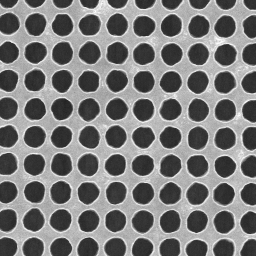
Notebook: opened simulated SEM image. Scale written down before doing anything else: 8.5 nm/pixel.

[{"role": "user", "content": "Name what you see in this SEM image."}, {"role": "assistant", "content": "a regular array of holes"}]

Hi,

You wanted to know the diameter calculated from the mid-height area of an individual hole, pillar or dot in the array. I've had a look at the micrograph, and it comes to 0.184 um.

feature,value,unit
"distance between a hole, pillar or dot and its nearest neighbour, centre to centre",229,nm